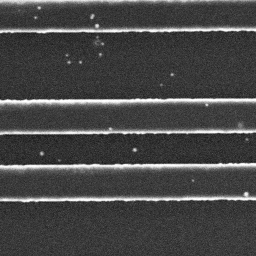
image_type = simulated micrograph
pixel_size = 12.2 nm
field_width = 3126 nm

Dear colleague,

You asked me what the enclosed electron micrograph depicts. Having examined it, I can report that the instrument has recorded lines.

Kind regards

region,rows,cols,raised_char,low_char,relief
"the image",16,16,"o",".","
oooooooooooooooo
oooooooooooooooo
................
................
................
................
oooooooooooooooo
oooooooooooooooo
................
................
oooooooooooooooo
oooooooooooooooo
ooooooooooo.....
................
................
................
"